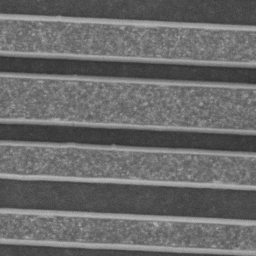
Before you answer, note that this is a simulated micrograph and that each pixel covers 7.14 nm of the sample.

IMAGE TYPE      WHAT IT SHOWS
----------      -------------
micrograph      one or a few lines or trenches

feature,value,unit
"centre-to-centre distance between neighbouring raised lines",454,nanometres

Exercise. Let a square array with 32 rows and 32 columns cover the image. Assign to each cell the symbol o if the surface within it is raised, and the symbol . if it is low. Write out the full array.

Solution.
................................
................................
ooooooooooo.....................
oooooooooooooooooooooooooooooooo
oooooooooooooooooooooooooooooooo
oooooooooooooooooooooooooooooooo
oooooooooooooooooooooooooooooooo
................oooooooooooooooo
................................
ooooo...........................
oooooooooooooooooooooooooo......
oooooooooooooooooooooooooooooooo
oooooooooooooooooooooooooooooooo
oooooooooooooooooooooooooooooooo
oooooooooooooooooooooooooooooooo
.........ooooooooooooooooooooooo
............................oooo
................................
ooooooooooooooo.................
oooooooooooooooooooooooooooooooo
oooooooooooooooooooooooooooooooo
oooooooooooooooooooooooooooooooo
..........oooooooooooooooooooooo
...............................o
................................
................................
ooooo...........................
oooooooooooooooooooooooooo......
oooooooooooooooooooooooooooooooo
oooooooooooooooooooooooooooooooo
......oooooooooooooooooooooooooo
...........................ooooo